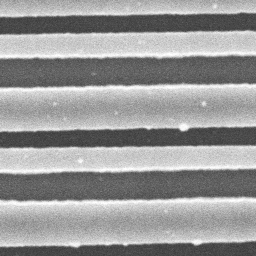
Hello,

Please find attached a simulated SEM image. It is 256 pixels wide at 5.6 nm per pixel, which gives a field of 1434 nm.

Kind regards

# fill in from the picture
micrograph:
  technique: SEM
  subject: lines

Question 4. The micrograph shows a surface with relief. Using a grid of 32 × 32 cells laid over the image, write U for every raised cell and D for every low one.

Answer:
UUUUUUUUUUUUUUUUUUUUUUUUUUUUUUUU
UUUUUUUUUUUUUUUUUUUUUUUUUUUUUUDU
DDDDDDDDDDDDDDDDDDDDDDDDDDDDDDDD
DDDDDDDDDDDDDDDDDDDDDDDDDDDDDDDD
UUUUUUUUUUUUUUUUUUUUUUUUUUUUUUUU
UUUUUUUUUUUUUUUUUUUUUUUUUUUUUUUU
UUUUUUUUUUUUUUUUUUUUUUUUUUUUUUUU
DDDDDDDDDDDDDDDDDDDDDDDDDDDDDDDD
DDDDDDDDDDDDDDDDDDDDDDDDDDDDDDDD
DDDDDDDDDDDDDDDDDDDDDDDDDDDDDDDD
DDDDDDDDDDDDDDDDDDDDDDDDDDDDDDDD
UUUUUUUUUUUUUUUUUUUUUUUUUUUUUUUU
UUUUUUUUUUUUUUUUUUUUUUUUUUUUUUUU
UUUUUUUUUUUUUUUUUUUUUUUUUUUUUUUU
UUUUUUUUUUUUUUUUUUUUUUUUUUUUUUUU
UUUUUUUUUUUUUUUUUUUUUUUUUUUUUUUU
DDDDDDDDDDDDDDDDDDDDDDDDDDDDDDDD
DDDDDDDDDDDDDDDDDDDDDDDDDDDDDDDD
DDDDDDDUUUUUUDUUUUUUUUUUUUUUUUUU
UUUUUUUUUUUUUUUUUUUUUUUUUUUUUUUU
UUUUUUUUUUUUUUUUUUUUUUUUUUUUUUUU
UUUUUUDDDDDDDDDDDDDDDDDDDDDDDDDD
DDDDDDDDDDDDDDDDDDDDDDDDDDDDDDDD
DDDDDDDDDDDDDDDDDDDDDDDDDDDDDDDD
DDDDDDDDDDDDDDDDDDDDDDDDDDDDDDDD
UUUUUUUUUUUUUUUUUUUUUUUUUUUUUUUU
UUUUUUUUUUUUUUUUUUUUUUUUUUUUUUUU
UUUUUUUUUUUUUUUUUUUUUUUUUUUUUUUU
UUUUUUUUUUUUUUUUUUUUUUUUUUUUUUUU
UUUUUUUUUUUUUUUUUUUUUUUUUUUUUUUU
UUUUUUUUUUUUUUUUUDDDDDDDUDDDDDDD
DDDDDDDDDDDDDDDDDDDDDDDDDDDDDDDD